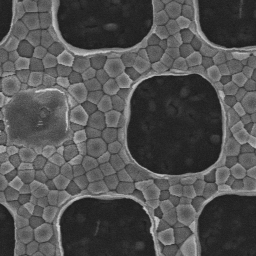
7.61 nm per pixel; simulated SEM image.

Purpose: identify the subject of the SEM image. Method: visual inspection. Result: holes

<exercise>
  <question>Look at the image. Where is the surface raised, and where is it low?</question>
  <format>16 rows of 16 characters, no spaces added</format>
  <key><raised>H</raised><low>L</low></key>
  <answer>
LHHHLLLLLLHHLLLL
LHHHLLLLLLHHLLLL
HHHHLLLLLHHHHLLL
HHHHHHHHHHHHHHHH
HHHHHHHHHHHHHHHH
HHHHHHHHHLLLLHHH
HHHHHHHHLLLLLLHH
HHHHHHHHLLLLLLHH
HHHHHHHHLLLLLLHH
HHHHHHHHLLLLLLHH
HHHHHHHHHLLLLHHH
HHHHHHHHHHHHHHHH
HHHHHLLLHHHHHLLL
LHHHLLLLLHHHLLLL
LHHHLLLLLHHHLLLL
LHHHLLLLLLHHLLLL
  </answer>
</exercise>